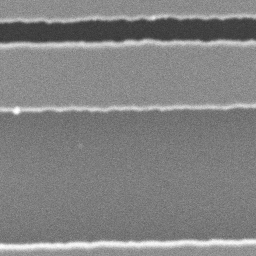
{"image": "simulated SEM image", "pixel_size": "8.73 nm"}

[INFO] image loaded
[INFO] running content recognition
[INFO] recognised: lines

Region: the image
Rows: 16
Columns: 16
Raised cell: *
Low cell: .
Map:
****************
................
.........*......
****************
****************
****************
****************
................
................
................
................
................
................
................
................
****************